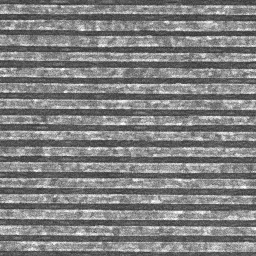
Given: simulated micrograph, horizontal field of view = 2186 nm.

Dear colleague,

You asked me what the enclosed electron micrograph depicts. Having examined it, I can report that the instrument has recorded parallel lines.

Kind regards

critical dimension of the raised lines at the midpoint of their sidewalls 72.6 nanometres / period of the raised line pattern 135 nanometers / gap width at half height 58.7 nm